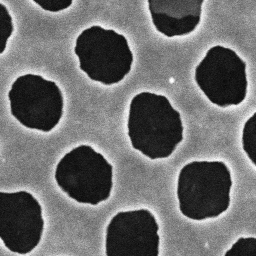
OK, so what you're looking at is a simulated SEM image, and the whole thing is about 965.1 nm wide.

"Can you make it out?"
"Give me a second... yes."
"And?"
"holes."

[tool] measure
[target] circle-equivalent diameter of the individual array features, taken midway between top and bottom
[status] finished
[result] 0.213 micrometres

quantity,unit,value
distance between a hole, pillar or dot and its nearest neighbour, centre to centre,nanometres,312